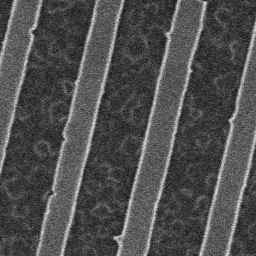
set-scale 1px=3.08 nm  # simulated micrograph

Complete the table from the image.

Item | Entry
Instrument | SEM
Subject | one or a few lines or trenches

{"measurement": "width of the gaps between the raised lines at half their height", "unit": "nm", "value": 166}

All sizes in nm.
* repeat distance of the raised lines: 246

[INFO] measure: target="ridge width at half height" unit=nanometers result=80.5